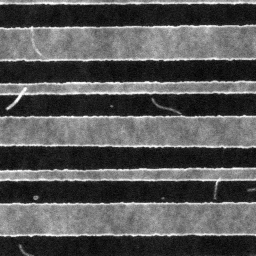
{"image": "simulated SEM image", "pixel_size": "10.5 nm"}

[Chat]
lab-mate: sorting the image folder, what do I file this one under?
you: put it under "lines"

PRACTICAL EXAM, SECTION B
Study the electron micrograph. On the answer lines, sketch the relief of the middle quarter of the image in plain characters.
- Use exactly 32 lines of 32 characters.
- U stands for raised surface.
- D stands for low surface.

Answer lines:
DDDDDDDDDDDDDDDDDDDDDDDDDDDDDDDD
DDDDDDDDDDDDDDDDDDDDDDDDDDDDDDDD
DDDDDDDDDDDDDDDDDDDDDDDDDDDDDDDD
DDDDDDDDDDDDDDDDDDDDDDDDDDDDDDDD
DDDDDDDDDDDDDDDDDDDDUDUUDDDDDDUU
UUUUUUUUUUUUUUUUUUUUUUUUUUUUUUUU
UUUUUUUUUUUUUUUUUUUUUUUUUUUUUUUU
DDDDDDDDDDDDDDDDDDDDDDDDDDDDDDDD
DDDDDDDDDDDDDDDDDDDDDDDDDDDDDDDD
DDDDDDDDDDDDDDDDDDDDDDDDDDDDDDDD
DDDDDDDDDDDDDDDDDDDDDDDDDDDDDDDD
DDDDDDDDDDDDDDDDDDDDDDDDDDDDDDDD
DDDDDDDDDDDDDDDDDDDDDDDDDDDDDDDD
UUUUUUUUUUUUUUUUUUUUUUUUUUUUUUUU
UUUUUUUUUUUUUUUUUUUUUUUUUUUUUUUU
UUUUUUUUUUUUUUUUUUUUUUUUUUUUUUUU
UUUUUUUUUUUUUUUUUUUUUUUUUUUUUUUU
UUUUUUUUUUUUUUUUUUUUUUUUUUUUUUUU
UUUUUUUUUUUUUUUUUUUUUUUUUUUUUUUU
UUUUUUUUUUUUUUUUUUUUUUUUUUUUUUUU
DDDDUDDDUUDDUUUUUUUUUUUUUUUUUUUU
DDDDDDDDDDDDDDDDDDDDDDDDDDDDDDDD
DDDDDDDDDDDDDDDDDDDDDDDDDDDDDDDD
DDDDDDDDDDDDDDDDDDDDDDDDDDDDDDDD
DDDDDDDDDDDDDDDDDDDDDDDDDDDDDDDD
DDDDDDDDDDDDDDDDDDDDDDDDDDDDDDDD
UDDDDDDDUUUUUUUUUUUUUUUUUUUUUUUU
UUUUUUUUUUUUUUUUUUUUUUUUUUUUUUUU
UUUUUUUUUUUUUUUUUUUUUUUUUUUUUUUU
DDDDDDDDDDDDDDDDDDDDDDDDDDDDDDDD
DDDDDDDDDDDDDDDDDDDDDDDDDDDDDDDD
DDDDDDDDDDDDDDDDDDDDDDDDDDDDDDDD